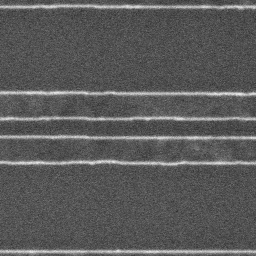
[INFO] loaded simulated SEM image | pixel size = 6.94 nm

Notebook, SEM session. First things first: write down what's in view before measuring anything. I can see lines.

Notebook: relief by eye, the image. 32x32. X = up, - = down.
XXXXXXXXXXXXXXXXXXXXXXXXXXXXXXXX
--------------------------------
--------------------------------
--------------------------------
--------------------------------
--------------------------------
--------------------------------
--------------------------------
--------------------------------
--------------------------------
--------------------------------
--------------------------------
XXXXXXXXXXXXXXXXXXXXXXXXXXXXXXXX
XXXXXXXXXXXXXXXXXXXXXXXXXXXXXXXX
XXXXXXXXXXXXXXXXXXXXXXXXXXXXXXXX
--------------------------------
--------------------------------
XXXXXXXXXXXXXXXXXXXXXXXXXXXXXXXX
XXXXXXXXXXXXXXXXXXXXXXXXXXXXXXXX
XXXXXXXXXXXXXXXXXXXXXXXXXXXXXXXX
-------------------XXXX---------
--------------------------------
--------------------------------
--------------------------------
--------------------------------
--------------------------------
--------------------------------
--------------------------------
--------------------------------
--------------------------------
--------------------------------
XXXXXXXXXXXXXXXXXXXXXXXXXXXXXXXX